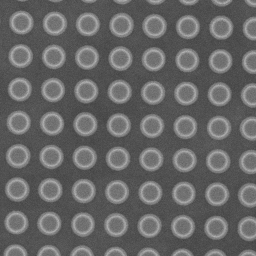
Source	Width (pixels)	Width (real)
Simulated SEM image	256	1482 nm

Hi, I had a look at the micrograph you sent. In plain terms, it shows an array of small figures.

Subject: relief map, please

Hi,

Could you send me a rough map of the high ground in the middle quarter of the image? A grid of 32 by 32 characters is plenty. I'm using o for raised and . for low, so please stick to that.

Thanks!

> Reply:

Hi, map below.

....oooo....oooo....ooooo...oooo
.............oo......ooo.....ooo
................................
................................
....oooo....oooo.....ooo........
...ooooo...ooooo....ooooo...oooo
...ooooo...oooooo..oooooo...oooo
...ooooo...oooooo..oooooo...oooo
...ooooo...oooooo...ooooo...oooo
....ooo......ooo....oooo....oooo
................................
................................
....ooo......oo.................
...ooooo...ooooo....oooo....oooo
..oooooo...oooooo..oooooo...oooo
..oooooo...oooooo..oooooo..ooooo
...ooooo...ooooo...oooooo..ooooo
....ooo.....oooo....oooo....oooo
.............................ooo
................................
....o...........................
...oooo....ooooo....oooo.....ooo
..oooooo...ooooo...oooooo...oooo
..oooooo...ooooo...oooooo..ooooo
..oooooo...ooooo...oooooo..ooooo
...oooo....ooooo...ooooo...ooooo
.............o......ooo.....oooo
................................
................................
...oooo.....ooo.....ooo......o..
..oooooo...ooooo...ooooo....oooo
..oooooo..oooooo...ooooo...ooooo